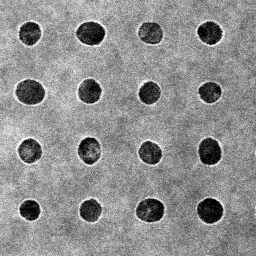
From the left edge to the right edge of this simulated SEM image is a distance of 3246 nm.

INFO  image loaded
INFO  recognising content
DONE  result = a regular array of holes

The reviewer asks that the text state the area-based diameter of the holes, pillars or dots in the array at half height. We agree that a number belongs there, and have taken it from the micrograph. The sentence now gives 314 nanometres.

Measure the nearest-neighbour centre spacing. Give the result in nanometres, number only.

748